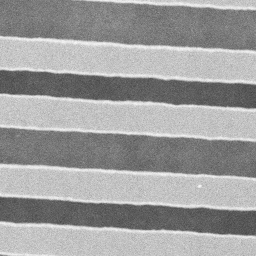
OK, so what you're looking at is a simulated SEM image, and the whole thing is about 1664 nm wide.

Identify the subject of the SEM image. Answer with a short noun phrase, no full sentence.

lines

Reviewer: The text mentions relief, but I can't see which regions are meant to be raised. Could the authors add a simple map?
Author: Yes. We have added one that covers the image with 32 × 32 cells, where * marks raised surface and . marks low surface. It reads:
..................**************
................................
................................
................................
................................
***************.................
********************************
********************************
********************************
.............*******************
...............................*
................................
************....................
*******************************.
********************************
********************************
...........*********************
..............................**
................................
................................
*...............................
******************..............
********************************
********************************
********************************
................****************
................................
................................
************.*..................
******************************..
********************************
********************************